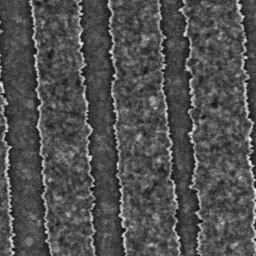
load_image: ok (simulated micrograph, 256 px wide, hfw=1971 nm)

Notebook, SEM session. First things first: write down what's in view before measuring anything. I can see one or a few lines or trenches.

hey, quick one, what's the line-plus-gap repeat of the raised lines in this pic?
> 78.2 px